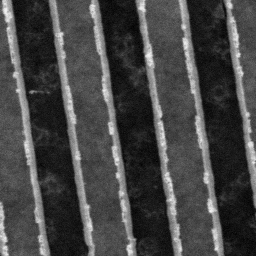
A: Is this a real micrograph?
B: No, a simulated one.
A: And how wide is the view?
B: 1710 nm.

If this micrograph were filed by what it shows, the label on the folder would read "one or a few lines or trenches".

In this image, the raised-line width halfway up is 287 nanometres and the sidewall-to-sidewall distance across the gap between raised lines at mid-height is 0.291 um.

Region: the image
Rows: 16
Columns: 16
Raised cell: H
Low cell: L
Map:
HLLHHHLLLHHLLLHH
HLLHHHLLLHHHLLHH
HLLLHHLLLHHHLLLH
HLLLHHLLLHHHLLLH
HLLLHHHLLHHHLLLH
HLLLHHHLLLHHLLLH
HHLLHHHLLLHHLLLH
HHLLHHHLLLHHHLLH
HHLLLHHLLLHHHLLH
HHLLLHHLLLHHHLLL
HHLLLHHHLLHHHLLL
HHLLLHHHLLHHHLLL
HHLLLHHHLLLHHLLL
HHHLLHHHLLLHHLLL
HHHLLHHHLLLHHHLL
HHHLLLHHLLLHHHLL